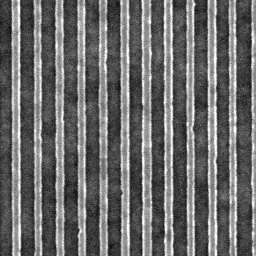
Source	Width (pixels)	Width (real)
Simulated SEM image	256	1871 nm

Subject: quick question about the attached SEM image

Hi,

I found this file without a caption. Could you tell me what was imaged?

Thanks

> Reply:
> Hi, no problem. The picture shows parallel lines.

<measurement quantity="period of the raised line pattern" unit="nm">158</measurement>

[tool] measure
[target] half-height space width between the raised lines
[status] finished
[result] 15 pixels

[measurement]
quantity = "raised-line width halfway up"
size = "0.0484 um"